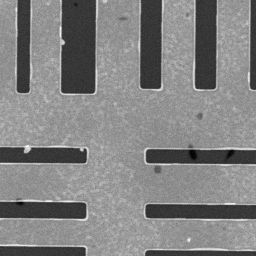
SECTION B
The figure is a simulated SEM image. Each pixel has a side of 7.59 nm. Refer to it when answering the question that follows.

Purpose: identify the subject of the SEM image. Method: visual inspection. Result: groups of lines, slits or small figures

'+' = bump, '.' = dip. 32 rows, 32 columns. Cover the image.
++..++++....+++++...++++...++++.
++..++++....+++++...++++...++++.
++..++++....+++++...++++...++++.
++..++++....+++++...++++...++++.
++..++++....+++++...++++...++++.
++..++++....+++++...++++...++++.
++..++++....+++++...++++...++++.
++..+++.....+++++...++++...++++.
++..++++....+++++...++++...++++.
++..++++....+++++...++++...++++.
++..+++.....+++++...++++...++++.
++..++++....++++++++++++++++++++
++++++++++++++++++++++++++++++++
++++++++++++++++++++++++++++++++
++++++++++++++++++++++++++++++++
++++++++++++++++++++++++++++++++
++++++++++++++++++++++++++++++++
++++++++++++++++++++++++++++++++
...+......++++++++++++++++++++++
...........+++++++..............
..++......+++++++++.............
++++++++++++++++++++++++++++++++
++++++++++++++++++++++++++++++++
++++++++++++++++++++++++++++++++
++++++++++++++++++++++++++++++++
...........++++++++.............
...........+++++++..............
++++++++++++++++++++++++++......
++++++++++++++++++++++++++++++++
++++++++++++++++++++++++++++++++
++++++++++++++++++++++++++++++++
...........+++++++..............